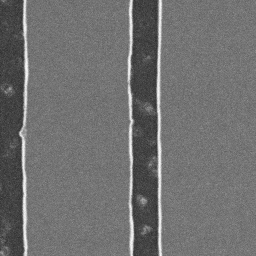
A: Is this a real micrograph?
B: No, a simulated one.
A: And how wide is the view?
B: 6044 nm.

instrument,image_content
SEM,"one or a few lines or trenches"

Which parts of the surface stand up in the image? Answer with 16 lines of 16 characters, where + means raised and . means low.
..++++++..++++++
..++++++..++++++
..++++++..++++++
..++++++..++++++
..++++++..++++++
..++++++..++++++
..++++++..++++++
..++++++..++++++
.+++++++..++++++
.+++++++..++++++
.+++++++..++++++
..++++++..++++++
..++++++..++++++
..++++++..++++++
..++++++..++++++
..++++++..++++++